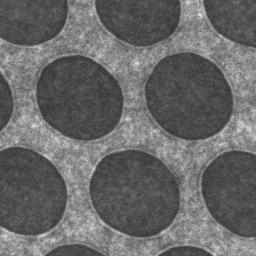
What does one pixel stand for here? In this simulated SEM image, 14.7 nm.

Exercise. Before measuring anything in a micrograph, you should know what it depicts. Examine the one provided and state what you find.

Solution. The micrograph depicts holes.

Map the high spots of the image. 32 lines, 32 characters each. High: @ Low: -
---------@@@-----------@@-------
---------@@@-----------@@@------
--------@@@@----------@@@@------
--------@@@@@---------@@@@------
-------@@@@@@@-------@@@@@@@----
@@---@@@@@@@@@@@---@@@@@@@@@@@--
@@@@@@@@@@@@@@@@@@@@@@@-@@@@@@@@
@@@@@@@-----@@@@@@@@------@@@@@@
@@@@@--------@@@@@@--------@@@@@
-@@@@---------@@@@@---------@@@@
-@@@@----------@@@-----------@@@
--@@-----------@@@-----------@@@
--@@@----------@@@-----------@@@
--@@@----------@@@-----------@@@
-@@@@----------@@@@----------@@@
-@@@@@---------@@@@@--------@@@@
@@@@@@@-------@@@@@@@------@@@@@
@@@@@@@@@---@@@@@@@@@@@--@@@@@@@
@---@@@@@@@@@@@@@@@@@@@@@@@@@@@@
-----@@@@@@@@------@@@@@@@@-----
-------@@@@@---------@@@@@------
-------@@@@@---------@@@@-------
--------@@@-----------@@@-------
--------@@@-----------@@@-------
--------@@@------------@@-------
--------@@@------------@@@------
--------@@@@----------@@@@------
--------@@@@@---------@@@@@-----
-------@@@@@@@-------@@@@@@@----
@@@--@@@@@@@@@@@---@@@@@@@@@@@--
@@@@@@@@@-@@@@@@@@@@@@@@@@@@@@@@
@@@@@@-------@@@@@@@------@@@@@@